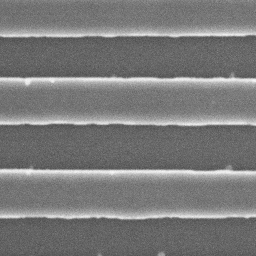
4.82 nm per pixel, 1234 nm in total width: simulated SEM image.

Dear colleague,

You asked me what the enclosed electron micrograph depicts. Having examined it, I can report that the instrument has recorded lines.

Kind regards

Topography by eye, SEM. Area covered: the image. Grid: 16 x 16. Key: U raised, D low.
UUUUUUUUUUUUUUUU
UUUUUUUUUUUUUUUU
DDDDDDDDDDDDDDDD
DDDDDDDDDDDDDDDD
DDDDDDDDDDDDDDDD
UUUUUUUUUUUUUUUU
UUUUUUUUUUUUUUUU
UUUUUUUUUUUUUUUU
DDDDDDDDDDDDDDDD
DDDDDDDDDDDDDDDD
DDDDDDDDDDDDDDDD
UUUUUUUUUUUUUUUU
UUUUUUUUUUUUUUUU
UUUUUUUUUUUUUUUU
DDDDDDDDDDDDDDDD
DDDDDDDDDDDDDDDD